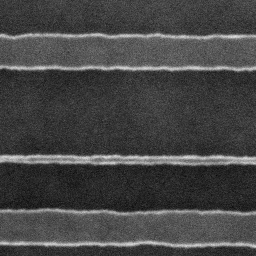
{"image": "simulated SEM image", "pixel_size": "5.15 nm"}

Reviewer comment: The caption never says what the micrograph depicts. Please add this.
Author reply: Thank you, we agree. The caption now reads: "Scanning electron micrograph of lines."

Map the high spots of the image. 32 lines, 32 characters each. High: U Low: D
DDDDDDDDDDDDDDDDDDDDDDDDDDDDDDDD
DDDDDDDDDDDDDDDDDDDDDDDDDDDDDDDD
DDDDDDDDDDDDDDDDDDDDDDDDDDDDDDDD
DDDDDDDDDDDDDDDDDDDDDDDDDDDDDDDD
UDDUUUUUUDUUUDDUUUUUUDDDDDDDDDDD
UUUUUUUUUUUUUUUUUUUUUUUUUUUUUUUU
UUUUUUUUUUUUUUUUUUUUUUUUUUUUUUUU
UUUUUUUUUUUUUUUUUUUUUUUUUUUUUUUU
DUUUUUDUUUUDUUUUUUUUUUUUUUUUUUUU
DDDDDDDDDDDDDDDDDDDDDDDDDDDDDDDD
DDDDDDDDDDDDDDDDDDDDDDDDDDDDDDDD
DDDDDDDDDDDDDDDDDDDDDDDDDDDDDDDD
DDDDDDDDDDDDDDDDDDDDDDDDDDDDDDDD
DDDDDDDDDDDDDDDDDDDDDDDDDDDDDDDD
DDDDDDDDDDDDDDDDDDDDDDDDDDDDDDDD
DDDDDDDDDDDDDDDDDDDDDDDDDDDDDDDD
DDDDDDDDDDDDDDDDDDDDDDDDDDDDDDDD
DDDDDDDDDDDDDDDDDDDDDDDDDDDDDDDD
DDDDDDDDDDDDDDDDDDDDDDDDDDDDDDDD
DDDDDDDDDDDDDDDDDDDDDDDDDDDDDDDD
DDDDDDDDDDDDDDDDDDDDDDDDUUDDDDDD
DDDDDDDDDDDDDDDDDDDDDDDDDDDDDDDD
DDDDDDDDDDDDDDDDDDDDDDDDDDDDDDDD
DDDDDDDDDDDDDDDDDDDDDDDDDDDDDDDD
DDDDDDDDDDDDDDDDDDDDDDDDDDDDDDDD
DDDDDDDDDDDDDDDDDDDDDDDDDDDDDDDD
UUUUUUUUUUUUUUDDDDDDUUUUUDUUDDDD
UUUUUUUUUUUUUUUUUUUUUUUUUUUUUUUU
UUUUUUUUUUUUUUUUUUUUUUUUUUUUUUUU
UUUUUUUUUUUUUUUUUUUUUUUUUUUUUUUU
DDDDDUUUUUUUUUUUUDDDUUUUUUUUUUUU
DDDDDDDDDDDDDDDDDDDDDDDDDDDDDDDD